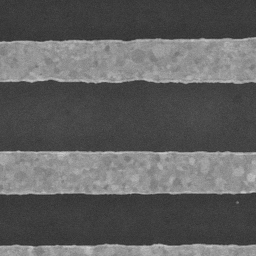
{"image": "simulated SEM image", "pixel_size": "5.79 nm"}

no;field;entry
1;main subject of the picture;lines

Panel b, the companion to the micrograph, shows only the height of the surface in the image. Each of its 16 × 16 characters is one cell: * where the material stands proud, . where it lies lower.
................
................
.........*******
****************
****************
................
................
................
................
***********.....
****************
****************
................
................
................
****************